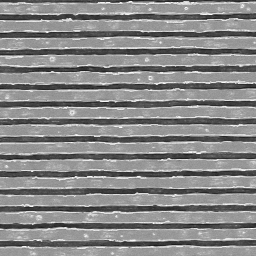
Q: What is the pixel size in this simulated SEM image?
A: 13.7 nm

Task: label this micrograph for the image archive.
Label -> parallel lines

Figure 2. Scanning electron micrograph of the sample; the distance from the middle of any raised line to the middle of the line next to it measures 0.238 um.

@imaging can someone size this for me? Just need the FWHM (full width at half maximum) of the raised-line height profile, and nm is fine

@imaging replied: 156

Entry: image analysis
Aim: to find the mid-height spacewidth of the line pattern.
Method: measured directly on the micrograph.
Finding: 6.12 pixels